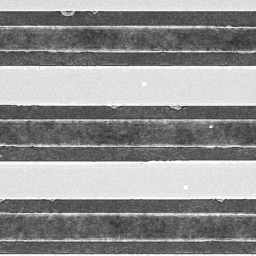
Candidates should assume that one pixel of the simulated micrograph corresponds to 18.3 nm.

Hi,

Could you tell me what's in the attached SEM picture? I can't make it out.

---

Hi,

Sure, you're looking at lines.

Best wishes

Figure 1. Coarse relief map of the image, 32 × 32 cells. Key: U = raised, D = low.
UUUUUUUUUUUUUUUUUUUUUUUUUUUUUUUU
DDDDDDDUUUDDDDDDDDDDDDDDDDDDDDDD
DDDDDDDDDDDDDDDDDDDDDDDDDDDDDDDD
UUUUUUUUUUUUUUUUUUUUUUUUUUUUUUUU
UUUUUUUUUUUUUUUUUUUUUUUUUUUUUUUU
UUUUUUUUUUUUUUUUUUUUUUUUUUUUUUUU
DDDDDDDDDDDDDDDDDDDDDDDDDDDDDDDD
DDDDDDDDDDDDDDDDDDDDDDDDDDDDDDDD
UUUUUUUUUUUUUUUUUUUUUUUUUUUUUUUU
UUUUUUUUUUUUUUUUUUUUUUUUUUUUUUUU
UUUUUUUUUUUUUUUUUUUUUUUUUUUUUUUU
UUUUUUUUUUUUUUUUUUUUUUUUUUUUUUUU
UUUUUUUUUUUUUUUUUUUUUUUUUUUUUUUU
DDDDDDDDDDDDDDDDDDDDDDDDDDDDDDDD
DDDDDDDDDDDDDDDDDDDDDDDDDDDDDDDD
UUUUUUUUUUUUUUUUUUUUUUUUUUUUUUUU
UUUUUUUUUUUUUUUUUUUUUUUUUUUUUUUU
UUUUUUUUUUUUUUUUUUUUUUUUUUUUUUUU
DDDDDDDDDDDDDDDDDDDDDDDDDDDDDDDD
DDDDDDDDDDDDDDDDDDDDDDDDDDDDDDDD
UUUUUUUUUUUUUUUUUUUUUUUUUUUUUUUU
UUUUUUUUUUUUUUUUUUUUUUUUUUUUUUUU
UUUUUUUUUUUUUUUUUUUUUUUUUUUUUUUU
UUUUUUUUUUUUUUUUUUUUUUUUUUUUUUUU
UUUUUUUUUUUUUUUUUUUUUUUUUUUUUUUU
DDDDDDDDDDDDDDDDDDDDDDDDDDDDDDDD
DDDDDDDDDDDDDDDDDDDDDDDDDDDDDDDD
UUUUUUUUUUUUUUUUUUUUUUUUUUUUUUUU
UUUUUUUUUUUUUUUUUUUUUUUUUUUUUUUU
UUUUUUUUUUUUUUUUUUUUUUUUUUUUUUUU
DDDDDDDDDDDDDDDDDDDDDDDDDDDDDDDD
DDDDDDDDDDDDDDDDDDDDDDDDDDDDDDDD